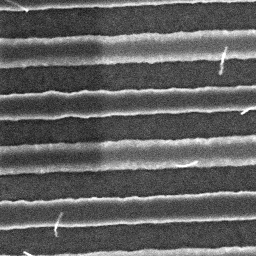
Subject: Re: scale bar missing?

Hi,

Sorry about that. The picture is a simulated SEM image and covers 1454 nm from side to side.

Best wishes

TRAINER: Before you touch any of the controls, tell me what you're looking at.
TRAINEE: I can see lines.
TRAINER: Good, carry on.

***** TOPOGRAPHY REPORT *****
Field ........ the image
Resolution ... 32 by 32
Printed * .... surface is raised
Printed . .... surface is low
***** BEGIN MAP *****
********************............
................................
................................
................................
.................***.***********
********************************
********************************
********************............
................................
................................
................................
......*...**********************
********************************
********************************
************....................
................................
................................
........................*.******
********************************
********************************
***************************.....
**..............................
................................
................................
....................************
********************************
********************************
***************************.....
***.............................
................................
................................
......................**********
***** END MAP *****